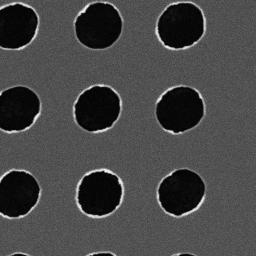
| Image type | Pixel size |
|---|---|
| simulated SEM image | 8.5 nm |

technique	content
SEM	holes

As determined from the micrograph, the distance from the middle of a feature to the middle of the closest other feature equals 697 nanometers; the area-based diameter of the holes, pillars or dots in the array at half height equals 387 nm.